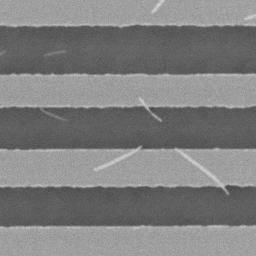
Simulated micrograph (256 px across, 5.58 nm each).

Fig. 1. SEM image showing lines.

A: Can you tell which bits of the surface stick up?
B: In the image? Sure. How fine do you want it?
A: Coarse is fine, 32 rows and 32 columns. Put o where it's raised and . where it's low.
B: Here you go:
oooooooooooooooooooooooooooooooo
oooooooooooooooooooooooooooooooo
oooooooooooooooooooooooooooooooo
................................
................................
................................
................................
................................
................................
oooooooooooooooooooooooooooooooo
oooooooooooooooooooooooooooooooo
oooooooooooooooooooooooooooooooo
oooooooooooooooooooooooooooooooo
................................
................................
................................
................................
................................
................................
oooooooooooooooooooooooooooooooo
oooooooooooooooooooooooooooooooo
oooooooooooooooooooooooooooooooo
oooooooooooooooooooooooooooooooo
................................
................................
................................
................................
................................
oooooooooooooooooooooooooooooooo
oooooooooooooooooooooooooooooooo
oooooooooooooooooooooooooooooooo
oooooooooooooooooooooooooooooooo